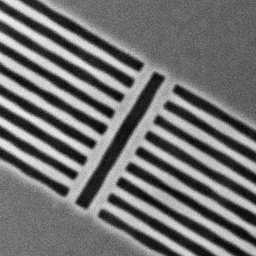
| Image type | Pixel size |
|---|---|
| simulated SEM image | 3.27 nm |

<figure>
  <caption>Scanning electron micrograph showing groups of lines, slits or small figures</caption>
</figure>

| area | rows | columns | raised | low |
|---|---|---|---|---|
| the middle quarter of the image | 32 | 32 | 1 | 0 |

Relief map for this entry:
00011100000011110000111111111111
00000111100000111101111111111111
11000001111000001111110011111111
11100000111100000111110001111111
01111000001111000011100001111111
00111110000111100111000011110111
00001111100001111111000011100001
10000011110000011110000111110000
11100001111100011100001111111000
11111000011110111100001110011110
00111100000111111000001110000111
00001111000001111000011111000001
10000011100001110000111111100000
11000001111011100000111001111000
11110000001111100001110000111110
00111100000111000011111100001111
00001110000110000011111110000011
00000111101110000111000111100001
11000001111100001111000001110000
11110000111100001111100000111100
00111000111000011111111000001111
00011111111000011100011100000011
00000111110000111100001111000001
10000011110000111110000011110000
11100011100001111111100000111100
01111111000011110001111000011110
00111111000011100000111100000111
00001110000111111000001111000001
10011100000111011110000011110000
11111100001110000111000001111000
11111000001110000011110000111110
01111000011111100000111100001111